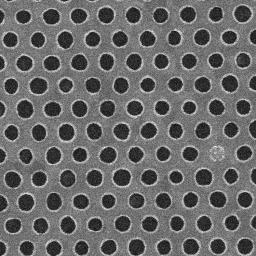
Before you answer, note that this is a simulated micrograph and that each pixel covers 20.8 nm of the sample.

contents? a regular array of holes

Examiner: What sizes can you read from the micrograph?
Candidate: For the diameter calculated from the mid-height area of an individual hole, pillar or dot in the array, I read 339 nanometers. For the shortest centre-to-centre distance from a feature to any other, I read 553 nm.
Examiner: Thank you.